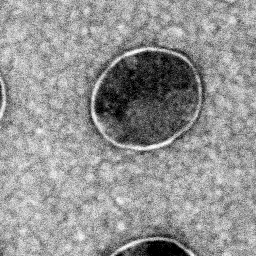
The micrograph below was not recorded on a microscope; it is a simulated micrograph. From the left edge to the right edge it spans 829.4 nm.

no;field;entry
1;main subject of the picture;raised bodies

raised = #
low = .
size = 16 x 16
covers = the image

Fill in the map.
................
................
................
........###.....
.......#####....
......#######...
......######....
......######....
.......####.....
................
................
................
................
................
................
........###.....